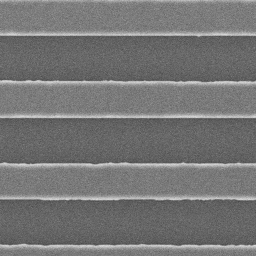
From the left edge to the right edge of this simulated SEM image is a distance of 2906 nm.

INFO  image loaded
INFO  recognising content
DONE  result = lines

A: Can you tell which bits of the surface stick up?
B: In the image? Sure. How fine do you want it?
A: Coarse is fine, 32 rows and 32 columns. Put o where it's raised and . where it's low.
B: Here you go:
oooooooooooooooooooooooooooooooo
oooooooooooooooooooooooooooooooo
oooooooooooooooooooooooooooooooo
oooooooooooooooooooooooooooooooo
................................
................................
................................
................................
................................
................................
oooooooooooooooooooooooooooooooo
oooooooooooooooooooooooooooooooo
oooooooooooooooooooooooooooooooo
oooooooooooooooooooooooooooooooo
oooooooooooooooooooooooooooooooo
................................
................................
................................
................................
................................
o............o.o......o.........
oooooooooooooooooooooooooooooooo
oooooooooooooooooooooooooooooooo
oooooooooooooooooooooooooooooooo
oooooooooooooooooooooooooooooooo
................................
................................
................................
................................
................................
................................
oooooooooooooooooooooooooooooooo